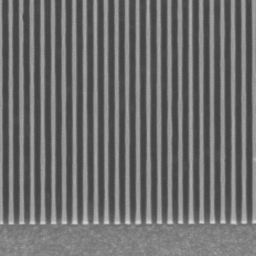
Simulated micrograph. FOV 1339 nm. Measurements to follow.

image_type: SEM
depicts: parallel lines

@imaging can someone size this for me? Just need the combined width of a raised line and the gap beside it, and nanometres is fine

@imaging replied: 55.4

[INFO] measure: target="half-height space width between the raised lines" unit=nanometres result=33.4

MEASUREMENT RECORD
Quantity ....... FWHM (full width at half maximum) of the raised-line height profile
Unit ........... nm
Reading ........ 24.2